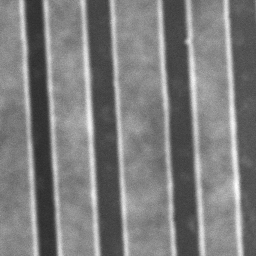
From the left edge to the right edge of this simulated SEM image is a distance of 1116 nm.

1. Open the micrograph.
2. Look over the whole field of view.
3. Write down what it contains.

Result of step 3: one or a few lines or trenches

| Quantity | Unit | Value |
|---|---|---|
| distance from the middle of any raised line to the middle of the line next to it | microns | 0.311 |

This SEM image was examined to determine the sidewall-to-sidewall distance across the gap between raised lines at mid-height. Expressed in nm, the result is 115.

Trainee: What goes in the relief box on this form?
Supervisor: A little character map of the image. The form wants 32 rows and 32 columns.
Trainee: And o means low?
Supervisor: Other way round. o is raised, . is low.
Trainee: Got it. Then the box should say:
ooo...ooooo...oooooo...ooooo....
ooo...ooooo...oooooo...ooooo....
ooo...ooooo...oooooo....oooo....
ooo...ooooo...oooooo....oooo....
ooo...ooooo...oooooo....ooooo...
ooo...ooooo...oooooo....ooooo...
ooo...ooooo...oooooo....ooooo...
ooo...ooooo...oooooo....ooooo...
ooo...ooooo...ooooooo...ooooo...
ooo...ooooo...ooooooo...ooooo...
ooo...ooooo...ooooooo...ooooo...
oooo..ooooo....oooooo...ooooo...
oooo..ooooo....oooooo...ooooo...
oooo..ooooo....oooooo...ooooo...
oooo..ooooo....oooooo...ooooo...
oooo..ooooo....oooooo...ooooo...
oooo..ooooo....oooooo...ooooo...
oooo..ooooo....oooooo...ooooo...
oooo...ooooo...oooooo...ooooo...
oooo...ooooo...oooooo...ooooo...
oooo...ooooo...oooooo....ooooo..
oooo...ooooo...oooooo....ooooo..
oooo...ooooo...oooooo....ooooo..
oooo...ooooo...oooooo....ooooo..
oooo...ooooo...oooooo....ooooo..
oooo...ooooo...oooooo....ooooo..
oooo...ooooo...ooooooo...ooooo..
oooo...ooooo...ooooooo...ooooo..
oooo...ooooo...ooooooo...ooooo..
ooooo..ooooo....oooooo...ooooo..
ooooo..ooooo....oooooo...ooooo..
ooooo..ooooo....oooooo...ooooo..